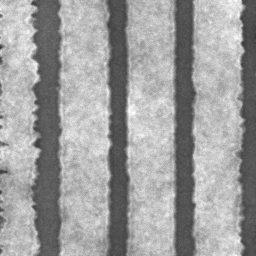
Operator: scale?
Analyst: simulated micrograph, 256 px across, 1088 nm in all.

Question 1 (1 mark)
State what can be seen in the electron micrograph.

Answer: one or a few lines or trenches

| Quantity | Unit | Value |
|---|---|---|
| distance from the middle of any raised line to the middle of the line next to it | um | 0.283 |